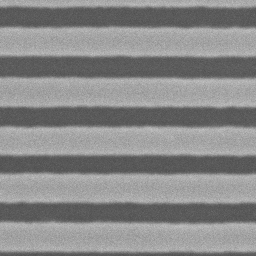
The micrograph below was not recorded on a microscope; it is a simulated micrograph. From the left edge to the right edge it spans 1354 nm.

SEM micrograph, lines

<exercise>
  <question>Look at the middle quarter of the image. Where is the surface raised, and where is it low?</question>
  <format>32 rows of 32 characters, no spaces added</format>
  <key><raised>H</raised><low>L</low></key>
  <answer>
LLLLLLLLLLLLLLLLLLLLLLLLLLLLLLLL
LLLLLLLLLLLLLLLLLLLLLLLLLLLLLLLL
LLLLLLLLLLLLLLLLLLLLLLLLLLLLLLLL
LLLLLLLLLLLLLLLLLLLLLLLLLLLLLLLL
HHHHHHHHHHHHHHHHHHHHHHHHHHHHHHHH
HHHHHHHHHHHHHHHHHHHHHHHHHHHHHHHH
HHHHHHHHHHHHHHHHHHHHHHHHHHHHHHHH
HHHHHHHHHHHHHHHHHHHHHHHHHHHHHHHH
HHHHHHHHHHHHHHHHHHHHHHHHHHHHHHHH
HHHHHHHHHHHHHHHHHHHHHHHHHHHHHHHH
LLHLLLLLLLLLHHLHLLLLLHHLLLLLLHLL
LLLLLLLLLLLLLLLLLLLLLLLLLLLLLLLL
LLLLLLLLLLLLLLLLLLLLLLLLLLLLLLLL
LLLLLLLLLLLLLLLLLLLLLLLLLLLLLLLL
LLLLLLLLLLLLLLLLLLLLLLLLLLLLLLLL
LLLLLLLLLLLLLLLLLLLLLLLLLLLLLLLL
HHHHHHHHHHHHHHHHHHHHHHHHHHHHHHHH
HHHHHHHHHHHHHHHHHHHHHHHHHHHHHHHH
HHHHHHHHHHHHHHHHHHHHHHHHHHHHHHHH
HHHHHHHHHHHHHHHHHHHHHHHHHHHHHHHH
HHHHHHHHHHHHHHHHHHHHHHHHHHHHHHHH
HHHHHHHHHHHHHHHHHHHHHHHHHHHHHHHH
HHHHHHHHHHHHHHHHHHHHHHHHHHHHHHHH
LLLLLLLLLLLLLLLLLLLLLLLLLLLLLLLL
LLLLLLLLLLLLLLLLLLLLLLLLLLLLLLLL
LLLLLLLLLLLLLLLLLLLLLLLLLLLLLLLL
LLLLLLLLLLLLLLLLLLLLLLLLLLLLLLLL
HHHHLLLLLLLLHLLLLLLLLLLLLLLLLLLL
HHHHHHHHHHHHHHHHHHHHHHHHHHHHHHHH
HHHHHHHHHHHHHHHHHHHHHHHHHHHHHHHH
HHHHHHHHHHHHHHHHHHHHHHHHHHHHHHHH
HHHHHHHHHHHHHHHHHHHHHHHHHHHHHHHH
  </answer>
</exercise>